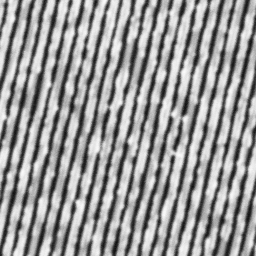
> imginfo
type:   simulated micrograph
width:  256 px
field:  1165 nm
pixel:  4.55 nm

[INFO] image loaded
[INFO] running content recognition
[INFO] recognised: parallel lines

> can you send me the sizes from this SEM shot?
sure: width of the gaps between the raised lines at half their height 4.99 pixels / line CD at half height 31.6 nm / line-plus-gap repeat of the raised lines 56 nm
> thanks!